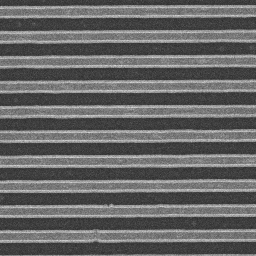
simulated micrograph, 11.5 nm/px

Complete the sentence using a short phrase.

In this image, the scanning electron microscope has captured parallel lines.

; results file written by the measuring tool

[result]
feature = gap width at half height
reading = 168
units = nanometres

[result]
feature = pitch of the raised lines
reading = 0.287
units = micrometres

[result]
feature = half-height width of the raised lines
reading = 10.1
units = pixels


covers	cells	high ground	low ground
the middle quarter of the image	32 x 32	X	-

XXXXXXXX----XXXXXXXXXXXXXXXXXXXX
--------------------------------
--------------------------------
--------------------------------
XX-------XX----------------XXXXX
XXXXXXXXXXXXXXXXXXXXXXXXXXXXXXXX
XXXXXXXXXXXXXXXXXXXXXXXXXXXXXXXX
--------------------------------
--------------------------------
--------------------------------
--------------------------------
XXXXXXXXXXXXXXXXXXXXXXXXXXXXXXXX
XXXXXXXXXXXXXXXXXXXXXXXXXXXXXXXX
--------------------------------
--------------------------------
--------------------------------
--------------------------------
XXXXXXXXXXXXXXXXXXXXXXXXXXXXXXXX
XXXXXXXXXXXXXXXXXXXXXXXXXXXXXXXX
--------------------------------
--------------------------------
--------------------------------
--------------------------------
XXXXXXXXXXXXXXXXXXXXXXXXXXXXXXXX
XXXXXXXXXXXXXXXXXXXXXXXXXXXXXXXX
XXXXXXXXXXXXXXXXXXXXXXXXXXXXXX--
--------------------------------
--------------------------------
--------------------------------
XXX-----XXXXXXXXXXXXXXXXXXXXXXXX
XXXXXXXXXXXXXXXXXXXXXXXXXXXXXXXX
XXXXXXXXXXXXXXXXXXXXXXXXXXXXXXXX